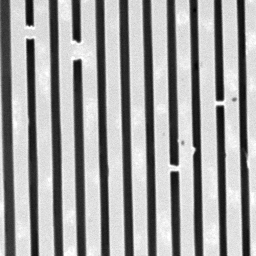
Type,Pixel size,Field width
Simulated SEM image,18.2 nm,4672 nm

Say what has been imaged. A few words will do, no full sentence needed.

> parallel lines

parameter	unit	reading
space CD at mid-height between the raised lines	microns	0.141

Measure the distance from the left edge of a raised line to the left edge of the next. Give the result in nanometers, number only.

429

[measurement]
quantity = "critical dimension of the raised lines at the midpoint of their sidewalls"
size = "0.283 µm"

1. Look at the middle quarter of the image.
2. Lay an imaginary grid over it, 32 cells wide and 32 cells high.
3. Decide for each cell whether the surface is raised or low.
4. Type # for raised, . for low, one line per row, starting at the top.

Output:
##..####..####..####..####..####
##..####..####..####..####..####
##..####..####..####..####..####
##..####...###...###..####..####
##...###...###...###..####..####
##...###...###...###..####..####
##...###...###...###..####..####
##...###...###...###..####..####
##...###...###...###..####..####
##...###...###...###..####..####
##...###...###...###..####..####
##...####..###...###..####...###
##...####..###...###...###...###
##...####..###...###...###...###
##...####..###...###...###...###
##...####..###...###...###...###
##...####..###...###...###...###
##...####..###...###...###...###
##...####..###...###...###...###
##...####..###...####..###..####
##...####..####..####..###...###
###..####..####..####..###...###
###..####..####..####..###...###
###..####..####..####..###...###
###..####..####..####..###...###
###..####..####..####..#########
###..####..####..####..#########
###..####..####..####..###...###
###..####..####..####..####..###
###..####..####..####..####..###
###..####..####..####..####..###
###..####..####..####..####..###